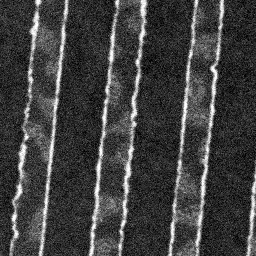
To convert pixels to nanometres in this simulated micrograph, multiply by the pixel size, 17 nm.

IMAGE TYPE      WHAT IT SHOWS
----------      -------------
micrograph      one or a few lines or trenches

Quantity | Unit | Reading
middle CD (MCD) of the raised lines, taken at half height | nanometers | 479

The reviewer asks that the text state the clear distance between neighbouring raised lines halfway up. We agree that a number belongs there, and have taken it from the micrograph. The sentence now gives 0.852 micrometres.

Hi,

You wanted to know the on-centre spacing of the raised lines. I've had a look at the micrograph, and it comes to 1330 nanometers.